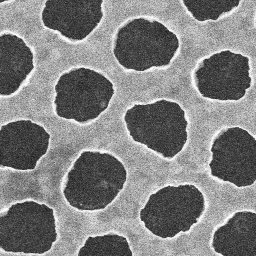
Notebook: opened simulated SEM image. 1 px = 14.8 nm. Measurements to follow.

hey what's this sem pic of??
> holes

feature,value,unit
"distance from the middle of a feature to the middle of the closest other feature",1220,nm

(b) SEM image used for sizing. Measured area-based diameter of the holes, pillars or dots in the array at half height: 850 nm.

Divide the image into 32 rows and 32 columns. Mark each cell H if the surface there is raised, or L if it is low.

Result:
HHHHHHLLLLLLLHHHHHHHHHHLLLLLLLHH
HHHHHLLLLLLLLHHHHHHHHHHHLLLLHHHH
HHHHHLLLLLLLLHHHLLHHHHHHHLHHHHHH
HHHHHHLLLLLLHHHLLLLLLHHHHHHHHHHH
LLHHHHHHLLLHHHLLLLLLLLHHHHHHHHHH
LLLHHHHHHHHHHHLLLLLLLLHHHHHHHHHH
LLLLHHHHHHHHHHLLLLLLLLHHHHHLLHHH
LLLLHHHHHHHHHHHLLLLLLHHHHHLLLLLH
LLLLHHHHHHLHHHHHLLLHHHHHHLLLLLLH
LLLHHHHHLLLLLHHHHHHHHHHHLLLLLLLH
LLLHHHHLLLLLLLHHHHHHHHHHHLLLLLLH
LLHHHHHLLLLLLLHHHHHHHHHHHLLLLLLH
HHHHHHHLLLLLLLHHHHHHHHHHHHHLLLHH
HHHHHHHLLLLLLHHHLLLLLLLHHHHHHHHH
HHHHHHHLLLLLHHHHLLLLLLLHHHHHHHHH
HLLLLHHHHHHHHHHHLLLLLLLHHHHHHHHH
LLLLLLHHHHHHHHHHLLLLLLLHHHHHLLLH
LLLLLLHHHHHHHHHHHLLLLLLHHHHLLLLL
LLLLLLHHHHHHHHHHHHHLLLLHHHLLLLLL
LLLLLHHHHHLLLLHHHHHHLLHHHHHLLLLL
LLLLLHHHHLLLLLLHHHHHHHHHHHLLLLLL
HHHHHHHHHLLLLLLLHHHHHHHHHHLLLLLL
HHHHHHHHLLLLLLLLHHHHHHHHHHHHLLLL
HHHHHHHHLLLLLLLHHHHHLLLLLHHHHHHH
HHHHHHHHLLLLLLLHHHHLLLLLLHHHHHHH
HHLLLHHHHLLLLLHHHHLLLLLLLLHHHHHH
HLLLLLLHHHHHHHHHHHLLLLLLLHHHHHLH
LLLLLLLHHHHHHHHHHHLLLLLLLHHHHLLL
LLLLLLLHHHHHHHHHHHLLLLLLHHHLLLLL
LLLLLLLHHHHHLLLHHHHHLLHHHHHLLLLL
LLLLLLLHHHHLLLLLHHHHHHHHHHLLLLLL
HHLLLLHHHHLLLLLLHHHHHHHHHHHLLLLL